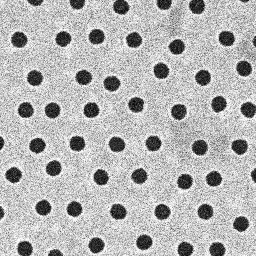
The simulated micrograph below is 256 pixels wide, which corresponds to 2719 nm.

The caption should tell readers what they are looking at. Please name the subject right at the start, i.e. a regular array of holes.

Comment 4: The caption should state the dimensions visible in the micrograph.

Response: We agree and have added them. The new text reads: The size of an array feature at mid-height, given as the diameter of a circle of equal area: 173 nanometres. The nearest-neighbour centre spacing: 357 nm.